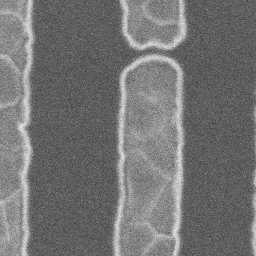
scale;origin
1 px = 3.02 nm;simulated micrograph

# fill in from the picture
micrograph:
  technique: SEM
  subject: one or a few lines or trenches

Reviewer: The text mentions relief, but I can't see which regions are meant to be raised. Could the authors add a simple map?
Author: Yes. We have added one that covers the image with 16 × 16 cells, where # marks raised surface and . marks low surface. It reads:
..######...#####
..######...#####
..######...#####
..##############
..######...#####
..######...#####
..######...#####
..######...#####
..######...#####
..######...#####
..######...#####
..######...#####
..######...#####
.#######...#####
..#####....#####
.######....#####